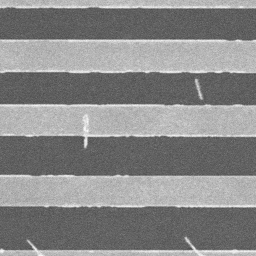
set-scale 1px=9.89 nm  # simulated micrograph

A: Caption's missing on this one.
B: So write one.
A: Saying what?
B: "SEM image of lines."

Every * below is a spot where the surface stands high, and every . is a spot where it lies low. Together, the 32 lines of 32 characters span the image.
********************************
................................
................................
................................
................................
********************************
********************************
********************************
********************************
................................
................................
................................
................................
********************************
********************************
********************************
********************************
................................
................................
................................
................................
................................
********************************
********************************
********************************
********************************
................................
................................
................................
................................
................................
********************************